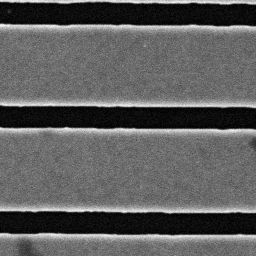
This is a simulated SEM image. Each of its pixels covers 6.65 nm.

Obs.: lines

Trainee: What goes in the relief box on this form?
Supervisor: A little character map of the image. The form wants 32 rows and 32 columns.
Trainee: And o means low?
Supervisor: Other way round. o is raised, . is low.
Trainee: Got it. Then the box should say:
................................
................................
................................
oooooooooooooooooooooooooooooooo
oooooooooooooooooooooooooooooooo
oooooooooooooooooooooooooooooooo
oooooooooooooooooooooooooooooooo
oooooooooooooooooooooooooooooooo
oooooooooooooooooooooooooooooooo
oooooooooooooooooooooooooooooooo
oooooooooooooooooooooooooooooooo
oooooooooooooooooooooooooooooooo
oooooooooooooooooooooooooooooooo
................................
................................
................................
oooooooooooooooooooooooooooooooo
oooooooooooooooooooooooooooooooo
oooooooooooooooooooooooooooooooo
oooooooooooooooooooooooooooooooo
oooooooooooooooooooooooooooooooo
oooooooooooooooooooooooooooooooo
oooooooooooooooooooooooooooooooo
oooooooooooooooooooooooooooooooo
oooooooooooooooooooooooooooooooo
oooooooooooooooooooooooooooooooo
...............oooo.oooooooooooo
................................
................................
oooooooooooooooooooooooooooooooo
oooooooooooooooooooooooooooooooo
oooooooooooooooooooooooooooooooo